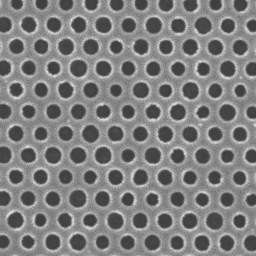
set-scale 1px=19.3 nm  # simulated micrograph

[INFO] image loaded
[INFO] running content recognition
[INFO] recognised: a regular array of holes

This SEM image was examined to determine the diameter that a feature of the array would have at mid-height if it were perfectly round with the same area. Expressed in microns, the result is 0.295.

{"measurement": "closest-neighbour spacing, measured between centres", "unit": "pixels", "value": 24.6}